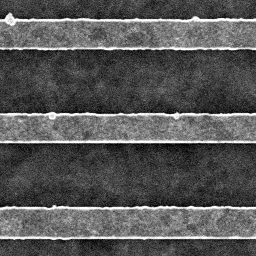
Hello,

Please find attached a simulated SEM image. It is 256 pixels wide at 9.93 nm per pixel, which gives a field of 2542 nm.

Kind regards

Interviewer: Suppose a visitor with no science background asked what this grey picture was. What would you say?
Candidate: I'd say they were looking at lines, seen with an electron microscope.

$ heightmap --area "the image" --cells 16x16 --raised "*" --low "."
................
****************
****************
................
................
................
................
****************
****************
................
................
................
................
****************
****************
................